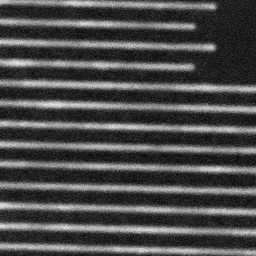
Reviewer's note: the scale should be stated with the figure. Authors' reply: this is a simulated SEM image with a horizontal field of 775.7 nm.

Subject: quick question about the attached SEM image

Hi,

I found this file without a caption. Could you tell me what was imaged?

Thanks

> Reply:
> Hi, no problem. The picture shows parallel lines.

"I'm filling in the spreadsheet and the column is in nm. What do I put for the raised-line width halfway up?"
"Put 12.9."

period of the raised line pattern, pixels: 20.4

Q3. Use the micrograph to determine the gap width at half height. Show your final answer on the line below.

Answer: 16.2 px